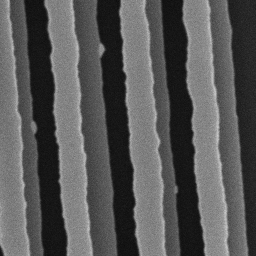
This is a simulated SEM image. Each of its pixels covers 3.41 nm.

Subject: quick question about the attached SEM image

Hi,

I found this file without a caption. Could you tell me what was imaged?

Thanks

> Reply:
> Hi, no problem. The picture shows lines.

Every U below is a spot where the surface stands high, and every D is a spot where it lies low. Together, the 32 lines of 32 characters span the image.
UUUDDDUUUUUUDDDUUUUUDDDUUUUUDDDD
UUUDDDUUUUUUDDDUUUUUDDDUUUUUDDDD
UUUDDDUUUUUUDDDUUUUUDDDUUUUUUDDD
UUUDDDUUUUUUDDDUUUUUDDDUUUUUUDDD
UUUDDDUUUUUUDDDUUUUUDDDUUUUUUDDD
UUUDDDUUUUUUUDDUUUUUDDDUUUUUUDDD
UUUDDDDUUUUUUDDUUUUUDDDUUUUUUDDD
UUUUDDUUUUUUUDDUUUUUUDDUUUUUUDDD
UUUUDDDUUUUUUDDUUUUUUDDUUUUUUDDD
UUUUDDDUUUUUUDDDUUUUUDDUUUUUUDDD
UUUUDDDUUUUUUDDDUUUUUDDUUUUUUDDD
UUUUDDDUUUUUUDDDUUUUUDDDUUUUUDDD
UUUUDDDUUUUUUDDDUUUUUDDDUUUUUDDD
UUUUDDDUUUUUUDDDUUUUUDDDUUUUUDDD
UUUUDDDUUUUUUDDDUUUUUDDDUUUUUUDD
UUUUDDDUUUUUUDDDUUUUUDDDUUUUUUDD
UUUUDDDUUUUUUDDDUUUUUDDDUUUUUUDD
UUUUDDDUUUUUUDDDUUUUUDDDUUUUUUDD
UUUUUDDUUUUUUDDDUUUUUDDDUUUUUUDD
UUUUUDDUUUUUUUDDUUUUUDDDUUUUUUDD
UUUUUDDDUUUUUUDDDUUUUUDDUUUUUUDD
UUUUUDDDUUUUUUDDDUUUUUDDUUUUUUDD
UUUUUDDUUUUUUUDDDUUUUUDDDUUUUUDD
UUUUUDDDUUUUUUDDDUUUUUDDDUUUUUDD
UUUUUDDDUUUUUUDDDUUUUUDDDUUUUUDD
UUUUUDDDUUUUUUDDDUUUUUDDDUUUUUUD
UUUUUDDDUUUUUUDDDUUUUUDDDUUUUUUD
UUUUUDDDUUUUUUDDDUUUUUDDDUUUUUUD
UUUUUDDDUUUUUUDDDUUUUUDDDUUUUUUD
UUUUUDDDUUUUUUDDDUUUUUDDDUUUUUUD
UUUUUDDDDUUUUUDDDUUUUUDDDDUUUUUD
UUUUUDDDUUUUUUUDDUUUUUDDDDUUUUUD